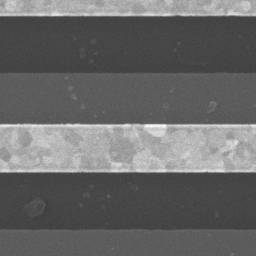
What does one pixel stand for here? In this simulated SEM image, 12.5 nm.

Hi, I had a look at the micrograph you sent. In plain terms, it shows lines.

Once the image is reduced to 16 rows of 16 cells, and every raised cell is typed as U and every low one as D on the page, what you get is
UUUUUUUUUUUUUUUU
DDDDDDDDDDDDDDDD
DDDDDDDDDDDDDDDD
DDDDDDDDDDDDDDDD
DDDDDDDDDDDDDDDD
UUUUUUUUUUUUUUUU
UUUUUUUUUUUUUUUU
UUUUUUUUUUUUUUUU
UUUUUUUUUUUUUUUU
UUUUUUUUUUUUUUUU
UUUUUUUUUUUUUUUU
DDDDDDDDDDDDDDDD
DDDDDDDDDDDDDDDD
DDDDDDDDDDDDDDDD
UUUUUUUUUUUUUUUU
UUUUUUUUUUUUUUUU